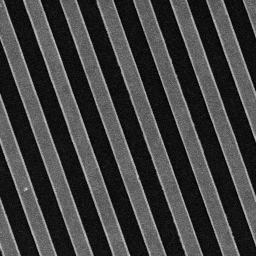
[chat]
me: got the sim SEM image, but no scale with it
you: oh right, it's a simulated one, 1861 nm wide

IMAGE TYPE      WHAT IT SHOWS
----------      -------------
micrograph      parallel lines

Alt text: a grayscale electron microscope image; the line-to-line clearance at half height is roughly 138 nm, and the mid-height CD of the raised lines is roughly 112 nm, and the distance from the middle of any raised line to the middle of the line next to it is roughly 251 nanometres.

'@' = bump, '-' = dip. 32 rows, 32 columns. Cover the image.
@--@@---@@--@@---@@--@@---@@---@
@--@@---@@---@@--@@---@@--@@---@
@---@@--@@---@@---@---@@---@@--@
@@--@@---@@--@@---@@--@@@--@@---
@@---@@--@@---@@--@@---@@--@@---
@@---@@--@@---@@---@@--@@---@@--
-@@--@@---@@--@@---@@---@@--@@--
-@@---@@--@@---@@--@@---@@--@@--
-@@---@@--@@@--@@---@@--@@---@@-
--@@--@@---@@--@@---@@---@@--@@-
--@@---@@--@@---@@--@@---@@--@@@
--@@---@@---@@--@@---@@--@@---@@
---@@--@@---@@--@@---@@---@@--@@
@--@@---@@--@@---@@--@@---@@---@
@--@@@--@@---@@--@@---@@--@@---@
@---@@--@@---@@--@@@--@@---@@--@
@@--@@---@@--@@---@@--@@---@@---
@@---@@--@@---@@--@@---@@--@@---
@@---@@--@@---@@---@@--@@---@@--
-@@--@@---@@--@@---@@---@---@@--
-@@---@@--@@---@@--@@---@@--@@--
-@@---@@--@@@--@@---@@--@@---@@-
--@@--@@---@@--@@---@@---@@--@@-
--@@---@@--@@---@@--@@---@@---@@
--@@---@@---@@--@@---@@--@@---@@
---@@--@@---@@--@@---@@---@@--@@
@--@@---@@--@@---@@--@@---@@---@
@--@@@--@@---@@--@@---@@--@@---@
@---@@--@@---@@--@@@--@@---@@--@
@@--@@---@@--@@---@@---@---@@---
@@---@@--@@---@@--@@---@@--@@---
@@---@@--@@---@@---@@--@@---@@--